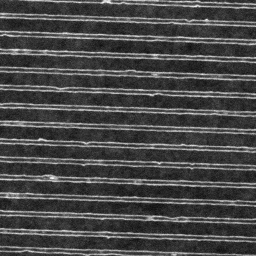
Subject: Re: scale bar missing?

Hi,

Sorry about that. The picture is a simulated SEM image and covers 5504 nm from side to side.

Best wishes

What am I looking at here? parallel lines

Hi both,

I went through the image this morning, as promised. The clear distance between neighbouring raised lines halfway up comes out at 285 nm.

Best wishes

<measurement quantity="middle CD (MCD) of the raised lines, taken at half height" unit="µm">0.105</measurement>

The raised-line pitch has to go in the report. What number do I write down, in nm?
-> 386